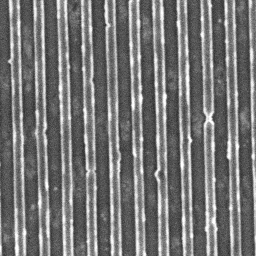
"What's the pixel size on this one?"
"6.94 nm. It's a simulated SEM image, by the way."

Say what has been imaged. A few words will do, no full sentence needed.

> parallel lines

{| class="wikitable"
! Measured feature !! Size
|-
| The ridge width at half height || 66.7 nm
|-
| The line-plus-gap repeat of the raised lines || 0.166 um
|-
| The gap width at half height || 98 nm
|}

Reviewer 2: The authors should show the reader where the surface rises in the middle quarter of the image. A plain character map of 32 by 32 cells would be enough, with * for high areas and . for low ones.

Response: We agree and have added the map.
*....**....**....**....**....**.
*....**....**....**....**....**.
*....**....**....**....**....**.
*....**....**....**....**....**.
*....**....**....**....**....**.
*....**....**....**....**....**.
*....**....**....**....**....**.
*....**....**....**....**....**.
*....***...**....***...***...**.
*....***...**....**....**....**.
*....**....**....**....**....**.
*....**....**....**....**....**.
*....**....**....**....**....**.
**...**....**....**....**....**.
**...**....**....**....**....**.
**...**....**....**....**....**.
**...**....**....**....**....**.
**...***...**....**....**....**.
**...***....**...***...**....***
**...***....**...***...**....***
**...***....**....*....**....**.
**...***....**...***...**....**.
**...***....**...***...**....**.
**....**....**....**....*....**.
**....**....**....*.....**...**.
**....**....**....**....**...**.
**....**....**....**...***....**
**....**....**....**...***....**
**....**....**....**...***....**
**....**....**....**....**....**
**....**....**....**....**....**
**....**....**....**....**....**